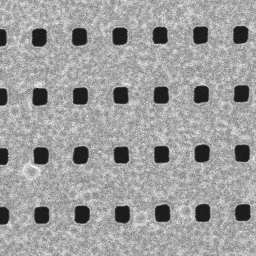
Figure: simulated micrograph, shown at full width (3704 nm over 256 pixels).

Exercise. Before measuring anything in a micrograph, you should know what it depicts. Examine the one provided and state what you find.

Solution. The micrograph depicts a regular array of holes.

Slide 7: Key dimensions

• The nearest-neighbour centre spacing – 0.58 micrometres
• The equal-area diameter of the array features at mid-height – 0.257 microns